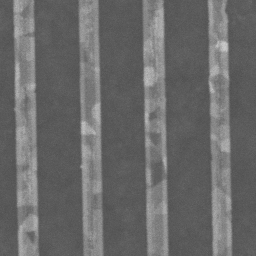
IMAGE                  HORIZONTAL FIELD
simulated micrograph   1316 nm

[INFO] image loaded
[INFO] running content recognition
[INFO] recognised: one or a few lines or trenches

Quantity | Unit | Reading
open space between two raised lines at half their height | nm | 255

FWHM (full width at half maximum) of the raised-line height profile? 78.3 nm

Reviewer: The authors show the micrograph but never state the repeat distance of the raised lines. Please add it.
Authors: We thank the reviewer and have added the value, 0.332 micrometres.